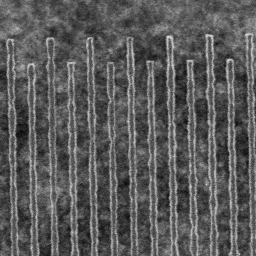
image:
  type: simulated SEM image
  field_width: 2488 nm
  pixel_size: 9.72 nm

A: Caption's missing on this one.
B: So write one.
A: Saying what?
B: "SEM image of parallel lines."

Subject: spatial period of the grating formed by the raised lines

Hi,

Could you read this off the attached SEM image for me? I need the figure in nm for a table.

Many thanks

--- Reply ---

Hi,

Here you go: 194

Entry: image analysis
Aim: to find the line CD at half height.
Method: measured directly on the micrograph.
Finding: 0.0535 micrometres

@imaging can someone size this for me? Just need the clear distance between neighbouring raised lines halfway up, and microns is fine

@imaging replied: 0.14